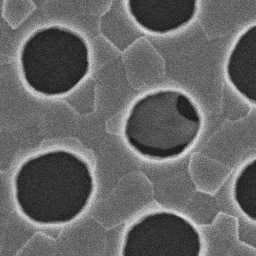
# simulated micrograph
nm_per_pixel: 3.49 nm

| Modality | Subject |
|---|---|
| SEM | holes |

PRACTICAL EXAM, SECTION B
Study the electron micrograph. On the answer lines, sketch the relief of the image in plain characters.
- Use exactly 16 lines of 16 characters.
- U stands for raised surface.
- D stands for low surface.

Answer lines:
UUUUUUUUDDDDUUUU
UUUUUUUUUDDUUUUU
UUDDDUUUUUUUUUUD
UDDDDUUUUUUUUUDD
UDDDDUUUUUUUUUDD
UUDDUUUUUUUUUUUD
UUUUUUUUUDDDUUUU
UUUUUUUUDDDDUUUU
UUUUUUUUDDDDUUUU
UUUDUUUUUDDUUUUU
UDDDDUUUUUUUUUUD
UDDDDDUUUUUUUUUD
UDDDDDUUUUUUUUUD
UUDDDUUUUDDUUUUU
UUUUUUUUDDDDUUUU
UUUUUUUUDDDDUUUU